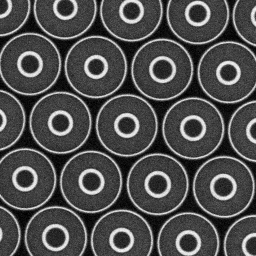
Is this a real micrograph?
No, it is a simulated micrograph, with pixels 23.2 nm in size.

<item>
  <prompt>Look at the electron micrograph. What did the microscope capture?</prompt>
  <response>an array of small figures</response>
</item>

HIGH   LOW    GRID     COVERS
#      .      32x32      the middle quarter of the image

......####.....##.....#####.....
#.....####.....##.....#####.....
#.....####.....##.....#####.....
#..............##......###......
#.............####.............#
##............####.............#
###..........######...........##
.####......#########.........###
...##########......###.....#####
.....######.........#########...
.....#####...........#######....
......###.............####......
......###..............###......
#......##.....###......##.......
##.....#.....#####.....##.....##
##....##.....#####.....##.....##
#.....##.....#####.....##.....##
......###.....###......##.....##
......###.............###.......
.....#####............####......
....######...........#####......
..#########.........#######.....
####.....#####....###########...
##.........#########.......####.
#...........#######.........####
.............####............###
..............###.............##
.....####.....###......#......##
....#####.....##.....#####.....#
....#####.....##.....#####.....#
.....####.....##.....#####.....#
.....####.....##.....#####.....#